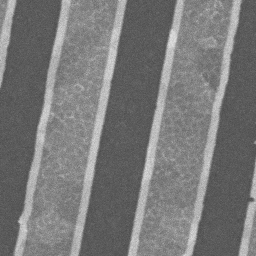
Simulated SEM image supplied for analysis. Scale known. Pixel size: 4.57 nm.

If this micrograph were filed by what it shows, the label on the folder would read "one or a few lines or trenches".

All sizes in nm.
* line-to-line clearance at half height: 253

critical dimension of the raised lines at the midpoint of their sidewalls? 258 nanometers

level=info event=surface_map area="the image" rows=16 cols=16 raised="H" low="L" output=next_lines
HLLLHHHHLLLHHHHL
LLLLHHHLLLLHHHHL
LLLLHHHLLLLHHHLL
LLLHHHHLLLLHHHLL
LLLHHHHLLLHHHHLL
LLLHHHHLLLHHHHLL
LLLHHHLLLLHHHHLL
LLLHHHLLLLHHHLLL
LLLHHHLLLLHHHLLL
LLHHHHLLLHHHHLLL
LLHHHHLLLHHHHLLL
LLHHHHLLLHHHHLLL
LLHHHLLLLHHHHLLL
LLHHHLLLLHHHLLLL
LHHHHLLLHHHHLLLH
LHHHHLLLHHHHLLLH